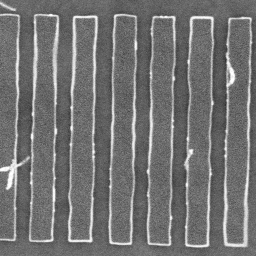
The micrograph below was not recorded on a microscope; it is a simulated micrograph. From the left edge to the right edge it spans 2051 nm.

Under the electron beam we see groups of lines, slits or small figures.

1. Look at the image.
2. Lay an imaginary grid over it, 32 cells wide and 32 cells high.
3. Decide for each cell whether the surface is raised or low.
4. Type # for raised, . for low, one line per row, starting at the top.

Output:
................................
................................
##..###..###..###..###..##...##.
##..###..###..###..###..##...##.
##...##..###..###..###..###.###.
##...##..###..###..###..###.###.
##...##..###..###..###..###.###.
##...##..###..###..###..##..###.
##..###..###..###..###..##..###.
##..###..###..###..###..##..###.
##..###..###..###..###..##..###.
##..###..###..###..###..##..###.
##..###..###..###..###..##..###.
##..###..###..###..###..##..###.
##..###..###..###..###..##..###.
##..###..###..###..###..##..###.
##..###..###..###..###..##..###.
##..###..###..###..##...##..###.
##..###..###..###..##..###..###.
##..###..###..###..##..###..###.
##..###..###..###..##..###..###.
##..###..###..###..##..###..###.
##..###..###..###..##..###..###.
##..###..###..###..##..###..###.
##..###..###..###..##..###..###.
##..###..###..##...##..###..###.
##..###..##...##...##..###..###.
##..###..##...##..###..###..###.
##..###..##...##..###..###..###.
##..###..##...##...##..###..###.
...................##..###...#..
................................